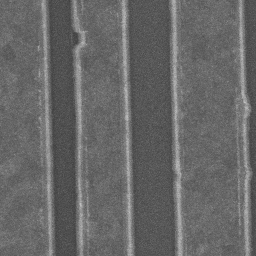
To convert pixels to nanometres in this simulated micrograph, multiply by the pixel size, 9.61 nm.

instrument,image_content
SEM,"one or a few lines or trenches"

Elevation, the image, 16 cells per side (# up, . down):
###..###...####.
###..###...####.
###..###...####.
###..###...####.
###..###...####.
###..###...####.
###..###...####.
###..###...####.
###..###...####.
###..###...####.
###..###...####.
###..###...####.
###..###...####.
###..###...####.
###..###...####.
###..###...####.